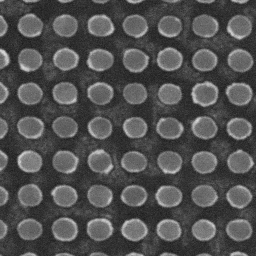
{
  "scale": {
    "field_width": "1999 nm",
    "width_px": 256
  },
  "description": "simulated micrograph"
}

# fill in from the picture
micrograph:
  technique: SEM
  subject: a regular array of raised bodies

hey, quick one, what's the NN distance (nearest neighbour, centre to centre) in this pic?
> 263 nanometres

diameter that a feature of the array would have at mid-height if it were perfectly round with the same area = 23 pixels